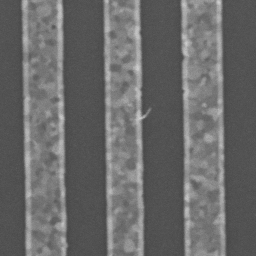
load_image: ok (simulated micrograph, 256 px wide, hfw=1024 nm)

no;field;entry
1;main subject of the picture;one or a few lines or trenches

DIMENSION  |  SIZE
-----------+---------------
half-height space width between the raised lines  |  0.19 microns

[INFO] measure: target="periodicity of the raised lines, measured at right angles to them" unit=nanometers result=318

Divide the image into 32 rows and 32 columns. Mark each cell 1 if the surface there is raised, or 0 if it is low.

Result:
00011110000001111000000111100000
00011110000001111000000111100000
00011110000001111000000111100000
00011111000001111000000111100000
00011110000001111000000111100000
00011110000001111000000111100000
00011110000001111000000111100000
00011110000000111000000111100000
00011110000000111000000111100000
00011110000000111000000111110000
00011111000000111000000111110000
00011111000000111000000111100000
00011111000000111000000111100000
00011111000000111000000111100000
00011111000000111000000111100000
00011111000000111000000111110000
00011111000000111000000111110000
00011111000000111000000111110000
00011111000000111000000111110000
00011111000000111000000111110000
00011111000000111000000111110000
00011111000000111000000111110000
00001111000000111000000111110000
00001111000000111000000111110000
00001111000000111100000111110000
00001111000000111100000111110000
00001111000000111100000111110000
00001111000000111100000111110000
00001111000000111100000011110000
00001111000000111000000011110000
00001111000000111000000011110000
00001111000000111000000011110000